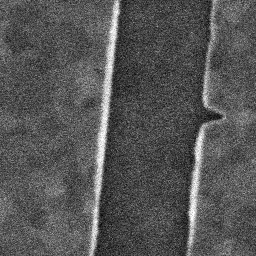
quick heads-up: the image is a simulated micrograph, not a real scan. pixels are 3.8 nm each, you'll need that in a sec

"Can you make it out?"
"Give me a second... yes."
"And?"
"one or a few lines or trenches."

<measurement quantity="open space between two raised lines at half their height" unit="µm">0.351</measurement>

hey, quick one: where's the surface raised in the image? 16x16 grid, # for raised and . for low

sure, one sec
#######......###
#######......###
#######......###
#######......###
#######......###
#######......###
#######......###
#######......###
#######.....####
######......####
######......####
######......####
######......####
######......####
######......####
######......####